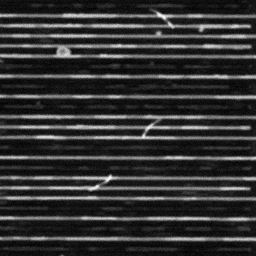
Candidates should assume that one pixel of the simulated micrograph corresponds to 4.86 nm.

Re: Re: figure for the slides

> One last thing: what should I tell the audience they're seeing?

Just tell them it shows parallel lines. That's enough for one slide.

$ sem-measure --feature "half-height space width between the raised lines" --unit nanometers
36.1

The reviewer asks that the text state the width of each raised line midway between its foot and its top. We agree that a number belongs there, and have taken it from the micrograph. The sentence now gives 12.8 nanometers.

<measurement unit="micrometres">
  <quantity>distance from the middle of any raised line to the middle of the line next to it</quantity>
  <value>0.0492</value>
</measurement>